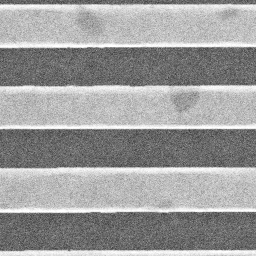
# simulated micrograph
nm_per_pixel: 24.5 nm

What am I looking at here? lines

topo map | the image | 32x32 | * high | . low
................................
********************************
********************************
********************************
********************************
********************************
................................
................................
................................
................................
................................
********************************
********************************
********************************
********************************
********************************
................................
................................
................................
................................
................................
*******************************.
********************************
********************************
********************************
********************************
................................
................................
................................
................................
................................
................................